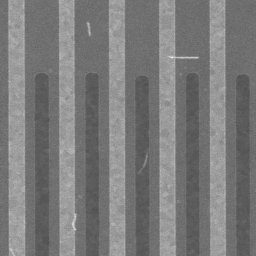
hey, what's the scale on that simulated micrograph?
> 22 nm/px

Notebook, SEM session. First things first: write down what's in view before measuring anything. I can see parallel lines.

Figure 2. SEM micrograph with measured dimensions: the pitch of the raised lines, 552 nm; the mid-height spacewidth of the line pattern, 223 nanometers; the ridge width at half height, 333 nm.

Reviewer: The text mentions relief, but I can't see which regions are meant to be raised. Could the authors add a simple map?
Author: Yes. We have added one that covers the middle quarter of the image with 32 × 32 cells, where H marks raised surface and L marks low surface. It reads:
HHLLLLLLLLLHHHHLLLLLLLLLHHHHLLLL
HHLLLLLLLLLHHHHLLLLLLLLLHHHHLLLL
HHLLLLHHLLLHHHHLLLLLLLLLHHHHLLLH
HHLLLHHHHLLHHHHLLLHHHLLLHHHHLLHH
HHLLLHHHHLLHHHHLLLHHHLLLHHHHLLHH
HHLLLHHHHLLHHHHLLLHHHLLLHHHHLLHH
HHLLLHHHHLLHHHHLLLHHHLLLHHHHLLHH
HHLLLHHHHLLLHHHLLLHHHLLLHHHHLLHH
HHLLLHHHHLLLHHHLLLHHHLLLHHHHLLHH
HHLLLHHHHLLLHHHLLLHHHLLLHHHHLLHH
HHLLLHHHHLLLHHHLLLHHHLLLHHHHLLLH
HHLLLHHHHLLLHHHLLLHHHLLLHHHHLLLH
HHLLLHHHHLLLHHHLLLHHHLLLHHHHLLLH
HHLLLHHHHLLLHHHLLLHHHLLLHHHHLLLH
HHLLLHHHHLLLHHHLLLHHHLLLHHHHLLLH
HHLLLHHHHLLLHHHLLLHHHLLLHHHHLLLH
HHLLLHHHHLLLHHHLLLHHHLLLHHHHLLLH
HHLLLHHHHLLLHHHLLLHHHLLLHHHHLLLH
HHLLLHHHHLLLHHHLLLHHHLLLHHHHLLLH
HHLLLHHHHLLLHHHLLLHHHLLLHHHHLLLH
HHLLLHHHHLLLHHHLLLHHHLLLHHHHLLLH
HHLLLHHHHLLLHHHLLLHHHLLLHHHHLLLH
HHLLLHHHHLLLHHHLLLHHHLLLHHHHLLLH
HHLLLHHHHLLLHHHLLLHHHLLLHHHHLLLH
HHLLLHHHHLLLHHHLLLHHHLLLHHHHLLLH
HHLLLHHHHLLLHHHLLLHHHLLLHHHHLLLH
HHLLLHHHHLLLHHHLLLHHHLLLHHHHLLLH
HHLLLHHHHLLLHHHLLLHHHLLLHHHHLLLH
HHLLLHHHHLLLHHHLLLHHHLLLHHHHLLLH
HHLLLHHHHLLLHHHLLLHHHLLLHHHHLLLH
HHLLLHHHHLLLHHHLLLHHHLLLHHHHLLLH
HHLLLHHHHLLLHHHLLLHHHLLLHHHHLLLH